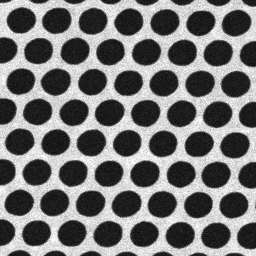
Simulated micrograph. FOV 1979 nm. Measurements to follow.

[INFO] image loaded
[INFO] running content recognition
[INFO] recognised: a regular array of holes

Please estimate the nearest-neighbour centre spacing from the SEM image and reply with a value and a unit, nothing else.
34.9 pixels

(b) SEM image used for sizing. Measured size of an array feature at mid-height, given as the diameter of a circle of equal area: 213 nm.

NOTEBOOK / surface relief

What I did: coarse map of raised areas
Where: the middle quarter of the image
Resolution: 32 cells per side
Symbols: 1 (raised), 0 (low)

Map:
11111111111111111111111111111011
11111100011111111111111110111111
01111000001111000001111000001111
00110000000110000001110000001110
00110000000110000000100000000100
01100000000110000000100000000100
01110000001110000001110000001110
11111000011111000011111000011111
11111111111111111111111111111111
10000111100000111110000111110000
00000011000000011000000011100000
00000011000000011000000011000000
00000011000000011000000011000000
00000011000000111000000011000000
00000111000000111000000111000000
10011111111011111110001111110011
11111100111111110111111111111111
01110000001111000011111000011111
01110000001110000001110000001110
00100000000100000001100000001100
01100000001100000001100000001100
01110000001110000001100000001100
11111000011110000011110000011110
11111111111111111111111111111111
10000111110001111110001111110011
00000011100000111100000111100000
00000011000000011000000011000000
00000011000000010000000011000000
00000011000000111000000011000000
00000111000000111000000111000000
10011111100011111100011111100001
11111111111111111111111111111111